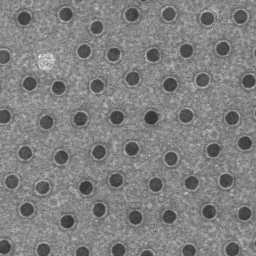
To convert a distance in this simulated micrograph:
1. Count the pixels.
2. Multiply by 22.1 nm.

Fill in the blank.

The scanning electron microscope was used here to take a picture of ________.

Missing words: a regular array of raised bodies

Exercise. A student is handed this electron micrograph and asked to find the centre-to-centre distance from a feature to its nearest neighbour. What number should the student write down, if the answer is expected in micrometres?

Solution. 0.728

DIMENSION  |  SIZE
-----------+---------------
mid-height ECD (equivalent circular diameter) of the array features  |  339 nm